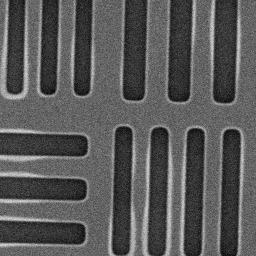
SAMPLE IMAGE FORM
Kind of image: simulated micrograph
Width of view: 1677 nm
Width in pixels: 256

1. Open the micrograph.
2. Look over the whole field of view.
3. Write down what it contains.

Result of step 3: groups of lines, slits or small figures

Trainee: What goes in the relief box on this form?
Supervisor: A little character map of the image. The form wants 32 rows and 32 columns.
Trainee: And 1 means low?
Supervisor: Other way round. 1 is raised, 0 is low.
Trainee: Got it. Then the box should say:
10011001100011110001100011100011
10011001100011100011100011100011
10011001100011100011100011100011
10011001100011100011100011100011
10011001100011100011100011100011
10011001100011100011100011100011
10011001100011100011100011100011
10011001100011100011100011100011
10011001100011100011100011100011
10011001100011100011100011100011
00011001100111100011100011100011
10011001100111100011100011100111
11111111111111110011100111100111
11111111111111111111111111111111
11111111111111111111111111111111
11111111111111111111111111111111
00011111111111000110011001110011
00000000000111000110011000110011
00000000000111000110011000110011
00000000001111000110011000110011
11111111111111000110011000110011
11111111111111000110011000110011
00000000001111000110011001110011
00000000000111001110011001110011
00000000000111001100011001110011
11111111111111001100011001110011
11111111111111001100011001110011
00011111111111000100011001100011
00000000000111000100011001100011
00000000000111000100011001100011
00000000001111000100011001100011
11111111111111001100011001100011